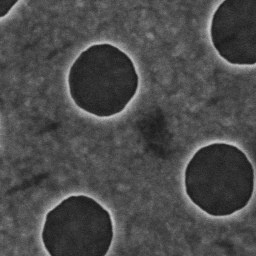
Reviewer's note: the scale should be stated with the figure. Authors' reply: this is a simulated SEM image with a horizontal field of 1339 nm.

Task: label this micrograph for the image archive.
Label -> holes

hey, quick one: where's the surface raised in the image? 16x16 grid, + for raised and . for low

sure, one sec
.+++++++++++++..
+++++++++++++...
+++++++++++++...
+++++...++++++..
++++....++++++++
++++.....+++++++
+++++...++++++++
++++++++++++++++
++++++++++++++++
++++++++++++...+
++++++++++++....
++++++++++++....
++++..++++++....
+++....+++++++++
+++....+++++++++
+++....+++++++++